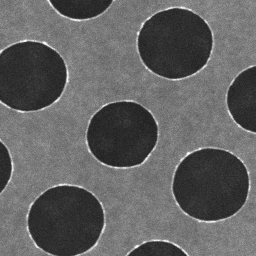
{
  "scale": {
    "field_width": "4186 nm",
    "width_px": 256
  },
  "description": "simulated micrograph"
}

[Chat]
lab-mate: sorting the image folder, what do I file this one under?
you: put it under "holes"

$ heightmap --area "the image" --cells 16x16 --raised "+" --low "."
+++....+++++++++
+++++++++....+++
+++++++++....+++
....+++++....+++
....++++++..+++.
....++++++++++..
...++++..+++++..
++++++....+++++.
+++++.....++++++
.+++++...+++..++
.++++++++++....+
+++++++++++.....
++....+++++....+
++....++++++..++
++....++++++++++
+++...+++..+++++